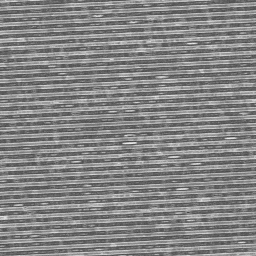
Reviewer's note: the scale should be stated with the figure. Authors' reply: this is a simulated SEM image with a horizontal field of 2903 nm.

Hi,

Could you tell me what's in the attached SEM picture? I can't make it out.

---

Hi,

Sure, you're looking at parallel lines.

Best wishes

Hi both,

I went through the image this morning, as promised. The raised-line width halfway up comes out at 31.1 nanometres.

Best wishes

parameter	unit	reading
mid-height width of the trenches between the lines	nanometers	59.5